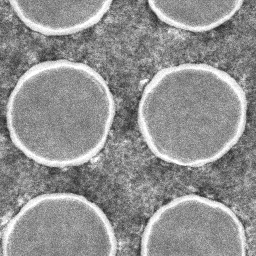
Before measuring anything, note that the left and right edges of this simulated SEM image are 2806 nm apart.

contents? raised bodies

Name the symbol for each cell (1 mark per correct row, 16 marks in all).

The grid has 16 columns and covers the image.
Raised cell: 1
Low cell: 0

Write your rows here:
0111111000111110
0011110000011100
0000000000000000
0000000000000000
0011110000111100
0111111001111110
0111111001111110
0111111001111110
0111111001111110
0011110000111100
0000000000000000
0000000000000000
0011100000011000
0111110000111110
1111111001111110
1111111001111110